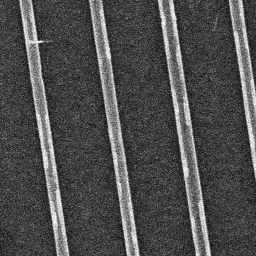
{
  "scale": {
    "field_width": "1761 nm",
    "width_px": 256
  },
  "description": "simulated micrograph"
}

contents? one or a few lines or trenches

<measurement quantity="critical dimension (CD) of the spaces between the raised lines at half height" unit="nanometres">391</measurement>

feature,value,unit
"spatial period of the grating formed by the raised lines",477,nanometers